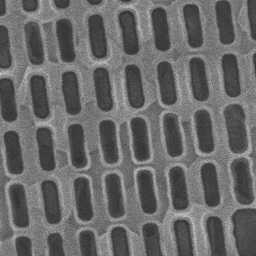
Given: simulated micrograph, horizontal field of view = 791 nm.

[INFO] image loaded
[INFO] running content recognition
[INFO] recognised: a regular array of holes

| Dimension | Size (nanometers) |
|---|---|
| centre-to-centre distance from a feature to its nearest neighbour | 98.5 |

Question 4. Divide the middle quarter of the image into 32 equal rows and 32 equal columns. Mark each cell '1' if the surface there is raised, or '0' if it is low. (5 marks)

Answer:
11111111111111110011111000011110
11111110000111100001111000011110
00011110000111100001111000011111
00011110000111100000111000001111
00011111000011100000111100001111
00001111000011100000111100001111
00001111000011100000111100001111
00001111000011110000111100001111
00001111000011110000111100001111
00001111000011110000111110001111
00001111000011111000111111111111
00001111100011111111111111111111
10001111111111111111111110001111
11111111111111111001111110001111
11111111100011111000111110000111
10001111100001111000011110000111
10000111100001111000011110000111
10000111100001111000011110000111
10000111100001111000011110000111
10000111100001111000011110000011
10000111100001111000011111000011
10000111100000111000011111000011
11000111110000111100011111000111
11000011110000111100011111111111
11000011110001111111111111111111
11000111111111111111111111111111
11111111111111111110011111000011
11111111111001111100001111000011
11100011110000111100001111000011
11000011110000111100001111000001
11000001110000111100000111000001
11100001110000011100000111100001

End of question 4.